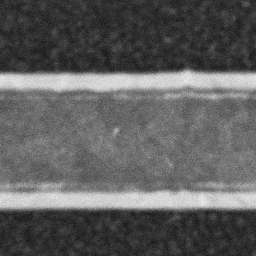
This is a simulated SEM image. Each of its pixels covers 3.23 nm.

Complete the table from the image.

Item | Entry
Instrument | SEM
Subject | one or a few lines or trenches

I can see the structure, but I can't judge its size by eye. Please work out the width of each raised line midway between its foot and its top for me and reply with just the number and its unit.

386 nm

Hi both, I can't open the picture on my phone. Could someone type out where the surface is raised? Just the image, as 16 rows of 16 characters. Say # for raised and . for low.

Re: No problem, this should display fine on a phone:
................
................
................
................
................
################
################
################
################
################
################
################
######........##
................
................
................